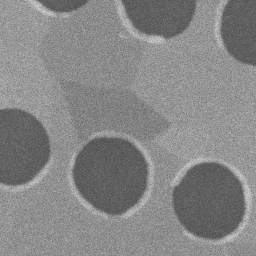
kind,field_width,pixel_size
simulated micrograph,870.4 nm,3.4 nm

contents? holes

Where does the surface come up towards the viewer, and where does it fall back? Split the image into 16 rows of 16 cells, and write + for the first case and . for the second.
+++..+++....++..
++++++++....++..
++++++++++++++..
++++++++++++++..
++++++++++++++++
++++++++++++++++
++++++++++++++++
..++++++++++++++
...+++++++++++++
...++....+++++++
...++....+++..++
..+++....++....+
+++++....++....+
+++++++++++....+
++++++++++++...+
++++++++++++++++